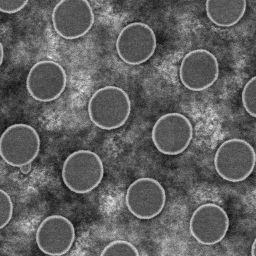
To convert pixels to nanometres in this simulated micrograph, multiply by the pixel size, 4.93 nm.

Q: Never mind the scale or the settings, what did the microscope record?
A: a regular array of raised bodies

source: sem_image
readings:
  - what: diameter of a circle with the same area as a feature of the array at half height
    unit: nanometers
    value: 191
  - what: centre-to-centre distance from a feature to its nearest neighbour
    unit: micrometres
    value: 0.337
